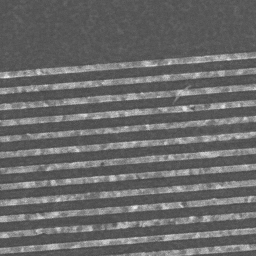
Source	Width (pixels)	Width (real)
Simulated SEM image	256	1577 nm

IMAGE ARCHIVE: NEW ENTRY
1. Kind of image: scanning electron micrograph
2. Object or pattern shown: parallel lines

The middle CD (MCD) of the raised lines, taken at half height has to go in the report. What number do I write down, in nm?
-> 32.2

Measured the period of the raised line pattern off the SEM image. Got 98.2 nm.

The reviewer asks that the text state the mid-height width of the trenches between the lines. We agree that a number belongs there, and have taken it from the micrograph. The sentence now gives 63.7 nm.